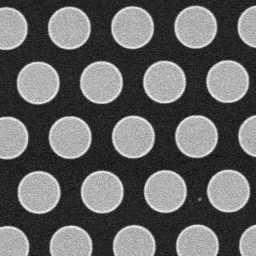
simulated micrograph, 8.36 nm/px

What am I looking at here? an array of small figures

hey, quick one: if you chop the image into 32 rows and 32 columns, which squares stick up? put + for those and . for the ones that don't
................................
++.....+++.....+++.....+++....++
+++...+++++...+++++...+++++...++
+++...+++++...+++++...+++++...++
+++...+++++...+++++...+++++...++
+++....+++.....+++.....+++.....+
................................
................................
...++++....++++....+++....++++..
..+++++...+++++...+++++...+++++.
..+++++...+++++...+++++...+++++.
..+++++...+++++...+++++...+++++.
...+++.....+++.....+++.....+++..
................................
................................
+++....++++....++++...+++++...++
+++...+++++...+++++...+++++...++
+++...+++++...+++++...+++++...++
+++....++++...+++++...+++++...++
++.....+++......++.....+++......
................................
....++......++......++.....+++..
...++++....++++...+++++...+++++.
..+++++...+++++...+++++...+++++.
..+++++...+++++...+++++...+++++.
...++++....++++....++++...+++++.
....++......++......+.......+...
................................
++......++......++.....+++.....+
+++....++++...+++++...+++++...++
++++..+++++...+++++...+++++...++
++++..+++++...+++++...+++++...++